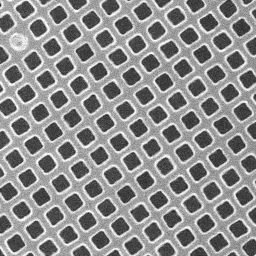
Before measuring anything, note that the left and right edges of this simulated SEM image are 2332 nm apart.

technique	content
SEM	a regular array of holes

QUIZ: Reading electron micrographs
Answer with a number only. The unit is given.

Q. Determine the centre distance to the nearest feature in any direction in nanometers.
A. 209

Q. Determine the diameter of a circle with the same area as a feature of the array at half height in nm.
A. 155